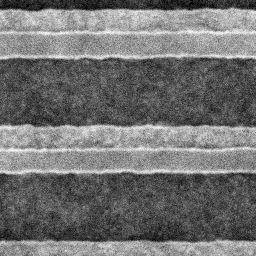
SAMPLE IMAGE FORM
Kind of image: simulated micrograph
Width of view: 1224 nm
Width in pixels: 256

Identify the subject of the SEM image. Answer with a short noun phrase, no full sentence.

lines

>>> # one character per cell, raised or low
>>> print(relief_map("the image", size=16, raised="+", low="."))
................
++++++++++++++++
++++++++++++++++
++++++++++.+.+++
................
................
................
................
++++++++++++++++
++++++++++++++++
++++++++++++++++
................
................
................
................
++++++++++++++++